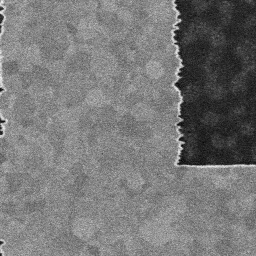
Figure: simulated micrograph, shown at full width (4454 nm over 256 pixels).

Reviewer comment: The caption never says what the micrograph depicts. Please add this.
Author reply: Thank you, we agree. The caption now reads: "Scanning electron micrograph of one or a few lines or trenches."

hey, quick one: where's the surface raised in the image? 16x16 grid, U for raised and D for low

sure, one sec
UUUUUUUUUUUDDDDD
UUUUUUUUUUUDDDDD
UUUUUUUUUUUDDDDD
UUUUUUUUUUUDDDDD
UUUUUUUUUUUDDDDD
UUUUUUUUUUUDDDDD
UUUUUUUUUUUDDDDD
UUUUUUUUUUUDDDDD
UUUUUUUUUUUDDDDD
UUUUUUUUUUUDDDDD
UUUUUUUUUUUUUUUU
UUUUUUUUUUUUUUUU
UUUUUUUUUUUUUUUU
UUUUUUUUUUUUUUUU
UUUUUUUUUUUUUUUU
UUUUUUUUUUUUUUUU